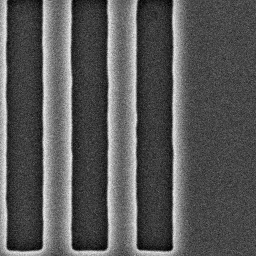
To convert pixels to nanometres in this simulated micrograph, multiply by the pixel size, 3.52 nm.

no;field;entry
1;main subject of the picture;groups of lines, slits or small figures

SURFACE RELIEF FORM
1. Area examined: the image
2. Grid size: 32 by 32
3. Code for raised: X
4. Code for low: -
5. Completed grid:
X----XXXX-----XXX-----XXXXXXXXXX
X----XXXX-----XXX-----XXXXXXXXXX
X----XXXX-----XXX-----XXXXXXXXXX
X----XXXX-----XXX-----XXXXXXXXXX
X----XXXX-----XXX-----XXXXXXXXXX
X----XXXX-----XXX-----XXXXXXXXXX
X----XXXX-----XXX-----XXXXXXXXXX
X----XXXX-----XXX-----XXXXXXXXXX
X----XXXX-----XXX-----XXXXXXXXXX
X----XXXX-----XXX-----XXXXXXXXXX
X----XXXX-----XXX-----XXXXXXXXXX
X-----XXX-----XXX-----XXXXXXXXXX
X----XXXX-----XXX-----XXXXXXXXXX
X----XXXX-----XXX-----XXXXXXXXXX
X----XXXX-----XXX-----XXXXXXXXXX
X----XXXX-----XXX-----XXXXXXXXXX
X----XXXX-----XXX-----XXXXXXXXXX
X----XXXX-----XXX-----XXXXXXXXXX
X----XXXX-----XXX-----XXXXXXXXXX
X----XXXX-----XXX-----XXXXXXXXXX
X----XXXX-----XXX-----XXXXXXXXXX
X-----XXX-----XXX-----XXXXXXXXXX
X----XXXX-----XXX-----XXXXXXXXXX
X----XXXX-----XXX-----XXXXXXXXXX
X----XXXX-----XXX-----XXXXXXXXXX
X----XXXX-----XXX-----XXXXXXXXXX
X----XXXX-----XXX-----XXXXXXXXXX
X----XXXX-----XXX-----XXXXXXXXXX
X----XXXX-----XXX-----XXXXXXXXXX
X----XXXX-----XXX-----XXXXXXXXXX
X----XXXX-----XXX-----XXXXXXXXXX
XX--XXXXXXXX-XXXXXX--XXXXXXXXXXX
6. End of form